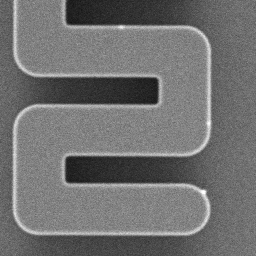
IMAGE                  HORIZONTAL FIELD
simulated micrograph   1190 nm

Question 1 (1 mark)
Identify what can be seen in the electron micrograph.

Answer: groups of lines, slits or small figures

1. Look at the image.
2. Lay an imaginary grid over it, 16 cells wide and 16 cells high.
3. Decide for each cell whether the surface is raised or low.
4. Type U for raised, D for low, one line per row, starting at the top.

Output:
DUUUDDDDDDDDDDDD
DUUUUDDDDDDDDDDD
DUUUUUUUUUUUUDDD
DUUUUUUUUUUUUDDD
DDUUUUUUUUUUUDDD
DDDDDDDDDDUUUDDD
DDDDDDDDDDUUUDDD
DUUUUUUUUUUUUDDD
DUUUUUUUUUUUUDDD
DUUUUUUUUUUUDDDD
DUUUDDDDDDDDDDDD
DUUUUDDDDDDDDDDD
DUUUUUUUUUUUUDDD
DUUUUUUUUUUUUDDD
DDUUUUUUUUUUDDDD
DDDDDDDDDDDDDDDD